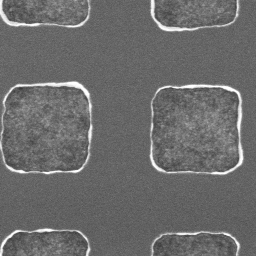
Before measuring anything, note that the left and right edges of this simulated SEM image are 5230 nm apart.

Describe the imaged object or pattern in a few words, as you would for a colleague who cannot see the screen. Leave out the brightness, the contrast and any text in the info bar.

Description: holes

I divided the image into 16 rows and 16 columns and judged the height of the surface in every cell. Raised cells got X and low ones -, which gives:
------XXXX-----X
X-X--XXXXX----XX
XXXXXXXXXXXXXXXX
XXXXXXXXXXXXXXXX
XXXXXXXXXXXXXXXX
X----XXXXX----XX
------XXXX-----X
------XXXX-----X
------XXX------X
------XXXX-----X
X----XXXXX-----X
XXXXXXXXXXXXXXXX
XXXXXXXXXXXXXXXX
XXXXXXXXXXXXXXXX
XX---XXXXXXXXXXX
-----XXXXX-----X